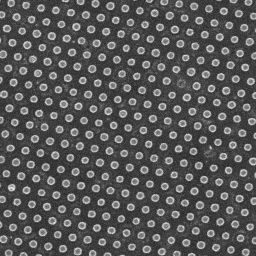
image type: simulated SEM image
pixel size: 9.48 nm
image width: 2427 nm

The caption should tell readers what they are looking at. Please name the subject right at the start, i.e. a regular array of raised bodies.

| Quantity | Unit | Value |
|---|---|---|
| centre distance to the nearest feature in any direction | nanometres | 141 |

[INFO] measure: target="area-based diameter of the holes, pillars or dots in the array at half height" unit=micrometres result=0.0651